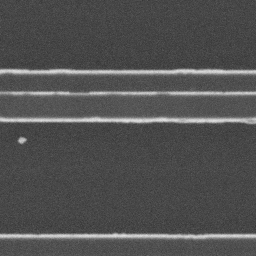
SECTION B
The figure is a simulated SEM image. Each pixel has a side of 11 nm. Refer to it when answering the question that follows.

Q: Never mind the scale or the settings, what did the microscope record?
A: lines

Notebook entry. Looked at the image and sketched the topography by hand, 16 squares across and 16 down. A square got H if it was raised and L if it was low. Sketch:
LLLLLLLLLLLLLLLL
LLLLLLLLLLLLLLLL
LLLLLLLLLLLLLLLL
LLLLLLLLLLLLLLLL
HHLHHHHLHHHHHHHH
HHHHHHHHHHHHHHHH
HHHHHHHHHHHHHHHH
HHHHHHHHHHHHHHHH
LLLLLLLLLLLLLLLL
LLLLLLLLLLLLLLLL
LLLLLLLLLLLLLLLL
LLLLLLLLLLLLLLLL
LLLLLLLLLLLLLLLL
LLLLLLLLLLLLLLLL
LLLLLLLLLLLLLLLL
HHHHHHHHHHHHHHHH